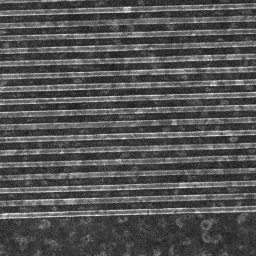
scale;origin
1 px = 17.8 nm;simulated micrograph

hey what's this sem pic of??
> parallel lines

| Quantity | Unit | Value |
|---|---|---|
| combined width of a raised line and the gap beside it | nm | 226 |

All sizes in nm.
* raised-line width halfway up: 80.1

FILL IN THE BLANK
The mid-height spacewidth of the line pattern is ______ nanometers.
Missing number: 145